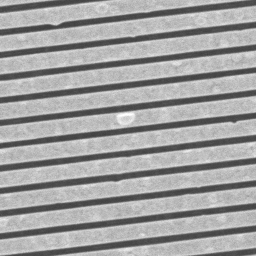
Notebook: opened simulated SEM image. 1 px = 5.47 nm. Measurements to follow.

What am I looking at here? parallel lines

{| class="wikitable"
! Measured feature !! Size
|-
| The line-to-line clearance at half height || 34.6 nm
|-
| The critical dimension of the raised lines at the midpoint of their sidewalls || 16.4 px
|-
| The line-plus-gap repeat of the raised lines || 123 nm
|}